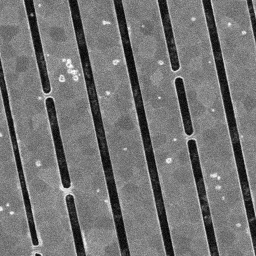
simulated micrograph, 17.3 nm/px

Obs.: parallel lines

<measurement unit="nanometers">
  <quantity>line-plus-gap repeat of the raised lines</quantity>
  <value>755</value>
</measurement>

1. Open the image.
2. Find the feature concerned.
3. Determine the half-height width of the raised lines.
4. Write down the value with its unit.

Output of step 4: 0.602 um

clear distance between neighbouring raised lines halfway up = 155 nm